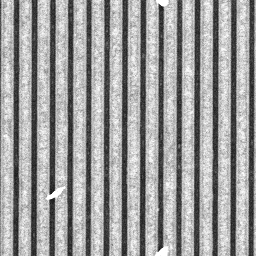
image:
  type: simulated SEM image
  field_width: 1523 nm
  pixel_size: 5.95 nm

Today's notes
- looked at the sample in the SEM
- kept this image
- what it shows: parallel lines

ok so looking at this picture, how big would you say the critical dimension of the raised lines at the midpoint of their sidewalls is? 0.0677 µm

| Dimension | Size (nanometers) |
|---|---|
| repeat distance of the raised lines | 108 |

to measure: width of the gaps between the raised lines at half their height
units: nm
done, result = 40.9